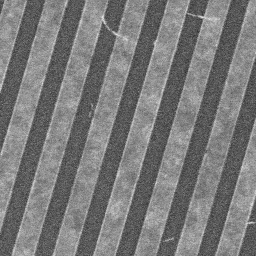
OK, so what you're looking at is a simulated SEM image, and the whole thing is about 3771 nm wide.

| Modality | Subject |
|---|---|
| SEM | parallel lines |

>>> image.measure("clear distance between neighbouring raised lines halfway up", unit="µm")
0.272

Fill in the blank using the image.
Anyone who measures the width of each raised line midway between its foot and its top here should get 297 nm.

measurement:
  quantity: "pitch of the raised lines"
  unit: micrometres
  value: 0.576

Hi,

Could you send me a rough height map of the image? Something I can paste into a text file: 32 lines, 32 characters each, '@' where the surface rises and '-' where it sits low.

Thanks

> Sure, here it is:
-@@---@@---@@---@@---@@@--@@@--@
@@@--@@@--@@@---@@---@@---@@---@
@@@--@@@--@@@--@@@--@@@--@@@---@
@@---@@---@@@--@@@--@@@--@@@--@@
@@--@@@---@@---@@---@@---@@@--@@
@@--@@@--@@@--@@@--@@@---@@---@@
@---@@@--@@@--@@@--@@@--@@@--@@@
@---@@---@@---@@---@@@--@@@--@@@
@--@@@--@@@--@@@---@@---@@---@@-
---@@@--@@@--@@@--@@@--@@@--@@@-
---@@---@@---@@@--@@@--@@@--@@@-
--@@@--@@@---@@---@@---@@---@@@-
--@@@--@@@--@@@--@@@--@@@---@@--
--@@---@@@--@@@--@@@--@@@--@@@--
--@@---@@---@@---@@---@@@--@@@--
-@@@--@@@--@@@---@@---@@---@@---
-@@@--@@@--@@@--@@@--@@@--@@@---
-@@---@@---@@---@@@--@@@--@@@--@
@@@--@@@---@@---@@---@@---@@---@
@@@--@@@--@@@--@@@--@@@---@@---@
@@---@@@--@@@--@@@--@@@--@@@--@@
@@---@@---@@---@@---@@@--@@@--@@
@@--@@@--@@@---@@---@@---@@---@@
@@--@@@--@@@--@@@--@@@--@@@---@@
@---@@---@@---@@@--@@@--@@@--@@@
@--@@@---@@---@@---@@---@@---@@@
@--@@@--@@@--@@@--@@@---@@---@@-
---@@@--@@@--@@@--@@@--@@@--@@@-
--@@@---@@---@@---@@@--@@@--@@@-
--@@@--@@@--@@@---@@---@@---@@--
--@@@--@@@--@@@--@@@--@@@--@@@--
--@@---@@---@@@--@@@--@@@--@@@--